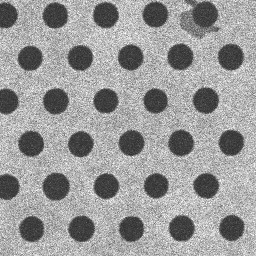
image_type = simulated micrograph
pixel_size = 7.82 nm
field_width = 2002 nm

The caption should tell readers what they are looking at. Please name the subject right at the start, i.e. a regular array of holes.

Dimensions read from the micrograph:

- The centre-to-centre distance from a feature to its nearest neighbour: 49.2 px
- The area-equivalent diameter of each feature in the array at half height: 200 nm